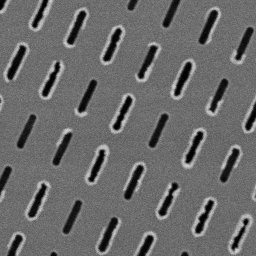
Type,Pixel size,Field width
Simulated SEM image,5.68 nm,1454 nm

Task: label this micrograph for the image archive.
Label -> a regular array of holes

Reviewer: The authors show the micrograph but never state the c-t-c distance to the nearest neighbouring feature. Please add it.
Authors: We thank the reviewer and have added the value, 222 nm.